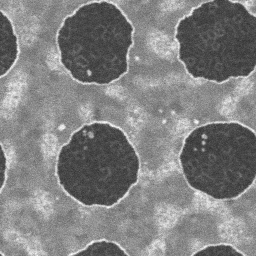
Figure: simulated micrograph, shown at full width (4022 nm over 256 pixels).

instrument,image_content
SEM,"holes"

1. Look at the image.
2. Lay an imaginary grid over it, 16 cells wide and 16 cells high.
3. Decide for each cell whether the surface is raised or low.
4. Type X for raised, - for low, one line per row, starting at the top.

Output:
XXXXX--XXXXX---X
-XXX----XXX-----
-XXX----XXX-----
-XXX----XXX-----
XXXX----XXXX----
XXXXXXXXXXXXXXXX
XXXXXXXXXXXXXXXX
XXXXXXXXXXXXXXXX
XXXXX---XXXX----
XXXX----XXX-----
XXXX-----XX-----
XXXX----XXXX----
XXXXX--XXXXXXXXX
XXXXXXXXXXXXXXXX
XXXXXXXXXXXXXXXX
XXXXX---XXXXX--X